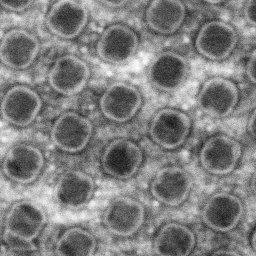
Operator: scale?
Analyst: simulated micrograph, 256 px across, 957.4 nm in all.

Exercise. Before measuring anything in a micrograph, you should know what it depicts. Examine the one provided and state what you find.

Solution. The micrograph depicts a regular array of raised bodies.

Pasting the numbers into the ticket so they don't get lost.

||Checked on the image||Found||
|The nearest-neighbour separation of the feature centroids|0.213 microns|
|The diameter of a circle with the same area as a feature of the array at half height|36.9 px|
